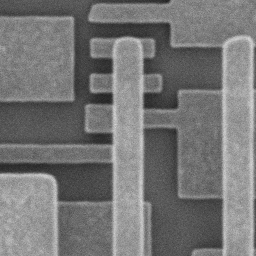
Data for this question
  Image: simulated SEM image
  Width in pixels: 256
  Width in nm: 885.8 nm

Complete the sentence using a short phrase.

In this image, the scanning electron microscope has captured wiring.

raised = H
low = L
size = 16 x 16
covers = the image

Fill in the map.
LLLLLLLLLLLLLLLL
LLLLLLLLLLLLLLLL
LLLLLLLLLLLLLLHH
LLLLLLLHHLLLLLHH
LLLLLLLHHLLLLLHH
LLLLLLLHHLLLLLHH
LLLLLLLHHLLLLLHH
LLLLLLLHHLLLLLHH
LLLLLLLHHLLLLLHH
LLLLLLLHHLLLLLHH
LLLLLLLHHLLLLLHH
HHHLLLLHHLLLLLHH
HHHHLLLHHLLLLLHH
HHHHLLLHHLLLLLHH
HHHHLLLHHLLLLLHH
HHHHLLLHHLLLLLHH